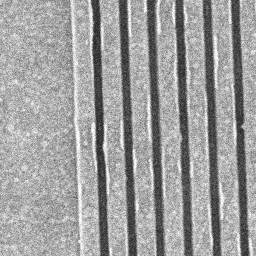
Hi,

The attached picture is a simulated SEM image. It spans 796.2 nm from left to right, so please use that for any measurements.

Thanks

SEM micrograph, parallel lines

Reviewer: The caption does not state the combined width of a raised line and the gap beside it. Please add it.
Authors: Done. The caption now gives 87 nm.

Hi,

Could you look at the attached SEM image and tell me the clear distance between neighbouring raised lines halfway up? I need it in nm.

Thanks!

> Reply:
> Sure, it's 24.4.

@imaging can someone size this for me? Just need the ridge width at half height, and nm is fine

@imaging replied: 60.9